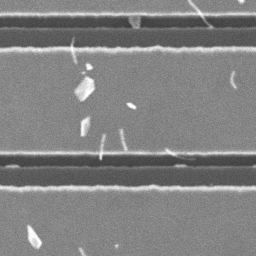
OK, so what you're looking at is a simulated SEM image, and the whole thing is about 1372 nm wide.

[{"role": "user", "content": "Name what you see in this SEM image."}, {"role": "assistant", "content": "lines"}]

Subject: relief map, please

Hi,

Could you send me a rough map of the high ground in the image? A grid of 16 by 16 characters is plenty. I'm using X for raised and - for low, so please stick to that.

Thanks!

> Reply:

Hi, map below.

XXXXXXXXXXXXXXXX
----------------
----------------
XXXXXXXXXXXXXXXX
XXXXXXXXXXXXXXXX
XXXXXXXXXXXXXXXX
XXXXXXXXXXXXXXXX
XXXXXXXXXXXXXXXX
XXXXXXXXXXXXXXXX
XXXXXXXXXXXXXXXX
----------------
----------------
XXXXXXXXXXXXXXXX
XXXXXXXXXXXXXXXX
XXXXXXXXXXXXXXXX
XXXXXXXXXXXXXXXX